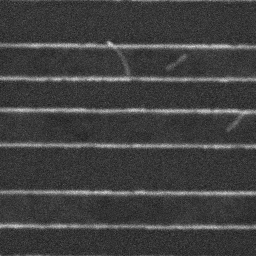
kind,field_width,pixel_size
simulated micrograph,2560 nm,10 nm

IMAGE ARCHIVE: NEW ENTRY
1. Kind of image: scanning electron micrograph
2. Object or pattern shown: lines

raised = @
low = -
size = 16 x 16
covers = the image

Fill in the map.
----------------
----------------
----------------
@@@@@@@@@@@@@@@@
@@@@@@@@@@@@@@@@
----------------
----------------
@@@@@@@@@@@@@@@@
@@@@@@@@@@@@@@@@
----------------
----------------
----------------
@@@@@@@@@@@@@@@@
@@@@@@@@@@@@@@@@
----------------
----------------